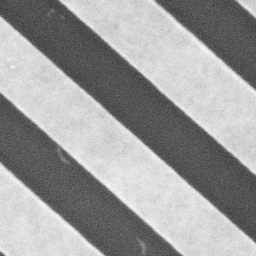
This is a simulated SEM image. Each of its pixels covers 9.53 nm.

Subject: lines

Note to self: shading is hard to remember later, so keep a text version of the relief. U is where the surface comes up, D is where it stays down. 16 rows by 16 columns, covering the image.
DDDDUUUUUUDDDDDU
UDDDDUUUUUUDDDDD
UUDDDDDUUUUUDDDD
UUUDDDDDUUUUUUDD
UUUUDDDDDUUUUUUD
UUUUUDDDDDUUUUUU
DUUUUUDDDDDUUUUU
DDUUUUUDDDDDUUUU
DDDUUUUUDDDDDUUU
DDDDUUUUUUDDDDUU
DDDDDUUUUUUDDDDU
UDDDDDUUUUUUDDDD
UUUDDDDDUUUUUDDD
UUUUDDDDDUUUUUDD
UUUUUDDDDDUUUUUD
UUUUUUDDDDDUUUUU